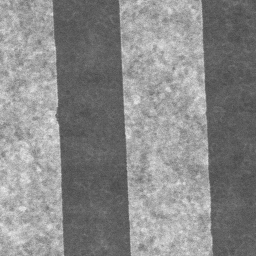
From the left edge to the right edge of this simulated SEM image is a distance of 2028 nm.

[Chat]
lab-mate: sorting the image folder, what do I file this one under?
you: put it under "one or a few lines or trenches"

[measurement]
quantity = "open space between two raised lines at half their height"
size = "67.3 px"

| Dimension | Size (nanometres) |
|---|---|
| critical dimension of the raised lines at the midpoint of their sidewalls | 642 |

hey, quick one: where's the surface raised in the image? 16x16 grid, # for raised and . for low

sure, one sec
###.....#####...
###.....#####...
###.....#####...
###.....#####...
###.....#####...
####....#####...
####....#####...
####....#####...
####....#####...
####....#####...
####....#####...
####....#####...
####....#####...
####....#####...
####....#####...
####....#####...